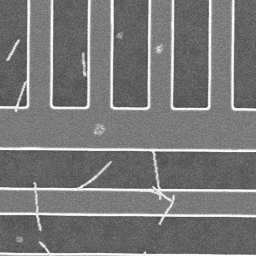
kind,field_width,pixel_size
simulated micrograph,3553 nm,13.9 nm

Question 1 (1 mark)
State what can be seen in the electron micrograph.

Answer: groups of lines, slits or small figures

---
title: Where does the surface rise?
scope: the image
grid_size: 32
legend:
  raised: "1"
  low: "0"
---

00001110000111000001110000111000
00001110000111000001110000111000
00001110000111000001110000111000
00001110000111000001110000111000
00001100000111000001110000111000
00001100000111000001110000111000
00001100000111000001110000111000
00001100000111000001110000111000
00001100000111000001110000111000
00001100000111000001110000111000
00001100000111000001110000111000
00001100000111000001110000111000
00001100000111000001110000111000
11111111111111100011110000111100
11111111111111111111111111111111
11111111111111111111111111111111
11111111111111111111111111111111
11111111111111111111111111111111
11111111111111111111111111111111
00000000000000000000000000000000
00000000000000000000000000000000
00000000000000000000000000000000
00000000000000000000000000000000
00001000000000000001000000000000
11111111111111111111111111111111
11111111111111111111111111111111
11111111111111111111111111111111
00000000000000000000000000000000
00000000000000000000000000000000
00000000000000000000000000000000
00000000000000000000000000000000
00000000000000000000000000000000